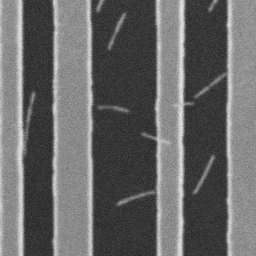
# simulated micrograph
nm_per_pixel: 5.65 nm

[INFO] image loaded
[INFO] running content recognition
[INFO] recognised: lines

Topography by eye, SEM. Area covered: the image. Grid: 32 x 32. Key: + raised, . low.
+++....++++.........+++......+++
+++....++++.........+++......+++
+++....++++.........+++.....++++
+++....++++.........+++.....++++
+++....++++.........+++......+++
+++....++++.........+++......+++
+++....++++.........+++......+++
+++....++++.........+++......+++
+++....++++.........+++.....++++
+++....++++.........+++......+++
+++....++++.........+++......+++
+++....++++.........+++......+++
+++....++++.........+++.....++++
+++....++++........++++.....++++
+++....++++.........+++.....++++
+++....++++.........+++.....++++
+++....++++.........+++.....++++
+++....++++.........+++.....++++
+++....++++.........+++.....++++
+++....++++.........+++.....++++
+++....++++.........+++......+++
+++....++++.........+++......+++
+++....++++.........+++......+++
+++....++++.........+++......+++
+++....++++.........+++.....++++
+++....++++.........+++.....++++
+++....++++.........+++......+++
+++....++++.........+++......+++
+++....++++.........+++......+++
+++....++++.........+++.....++++
+++....++++.........+++.....++++
+++....++++.........+++......+++